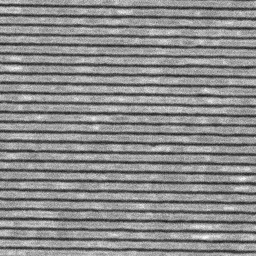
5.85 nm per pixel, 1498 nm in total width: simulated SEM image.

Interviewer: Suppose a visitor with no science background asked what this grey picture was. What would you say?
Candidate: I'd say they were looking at parallel lines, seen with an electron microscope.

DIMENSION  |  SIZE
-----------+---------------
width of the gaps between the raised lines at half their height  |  19.7 nanometres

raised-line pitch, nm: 56.8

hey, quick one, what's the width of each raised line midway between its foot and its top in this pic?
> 0.0351 microns